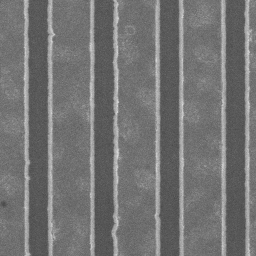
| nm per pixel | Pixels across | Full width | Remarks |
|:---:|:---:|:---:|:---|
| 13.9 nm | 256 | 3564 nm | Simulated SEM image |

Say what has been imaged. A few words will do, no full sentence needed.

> one or a few lines or trenches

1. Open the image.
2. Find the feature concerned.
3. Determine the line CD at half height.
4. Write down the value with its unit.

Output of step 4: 590 nanometres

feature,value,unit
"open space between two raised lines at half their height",327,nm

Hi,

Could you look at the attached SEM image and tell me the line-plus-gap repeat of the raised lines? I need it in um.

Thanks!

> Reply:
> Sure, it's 0.913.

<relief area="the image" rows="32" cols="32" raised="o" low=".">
ooo...ooooo...oooooo...ooooo...o
ooo...ooooo...oooooo...ooooo...o
ooo...oooooo..oooooo...ooooo...o
ooo...oooooo..oooooo...ooooo...o
ooo...oooooo..oooooo...ooooo...o
ooo...oooooo..oooooo...ooooo...o
ooo...oooooo..oooooo...ooooo...o
ooo...oooooo..oooooo...ooooo...o
ooo...oooooo..oooooo...ooooo...o
ooo...oooooo...ooooo...ooooo...o
ooo...oooooo..oooooo...ooooo...o
ooo...oooooo..oooooo...ooooo...o
ooo...oooooo..oooooo...ooooo...o
ooo...oooooo..oooooo...ooooo...o
ooo...oooooo..oooooo...ooooo...o
ooo...oooooo..oooooo...ooooo...o
ooo...oooooo..oooooo...ooooo...o
ooo...oooooo..oooooo...ooooo...o
ooo...oooooo...ooooo...ooooo...o
ooo...oooooo..oooooo...ooooo...o
ooo...oooooo..oooooo...ooooo...o
ooo...oooooo..oooooo...ooooo...o
ooo...oooooo..oooooo...ooooo...o
ooo...oooooo..oooooo...ooooo...o
ooo...oooooo..oooooo...ooooo...o
ooo...oooooo..oooooo...ooooo...o
ooo...oooooo..oooooo...ooooo...o
ooo...oooooo..oooooo...ooooo...o
ooo...oooooo..oooooo...ooooo...o
ooo...oooooo..oooooo...ooooo...o
ooo...oooooo..oooooo...ooooo...o
ooo...oooooo..oooooo...ooooo...o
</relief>